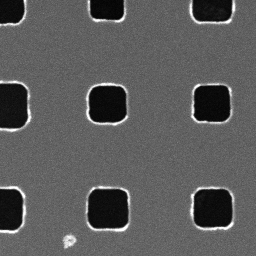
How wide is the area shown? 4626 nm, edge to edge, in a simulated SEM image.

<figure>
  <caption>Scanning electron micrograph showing holes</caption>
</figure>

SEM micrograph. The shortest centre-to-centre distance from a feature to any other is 1890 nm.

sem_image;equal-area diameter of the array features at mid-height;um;0.754